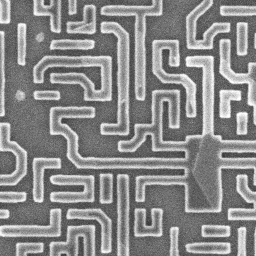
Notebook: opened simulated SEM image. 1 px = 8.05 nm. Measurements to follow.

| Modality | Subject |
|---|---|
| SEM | wiring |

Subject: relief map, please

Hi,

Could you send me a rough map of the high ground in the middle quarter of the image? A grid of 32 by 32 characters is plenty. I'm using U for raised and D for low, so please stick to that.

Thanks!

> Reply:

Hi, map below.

UUUUDDDDDUUUDDUUDDUUDDUUDDDDDDDD
DDDDDDDDDDUUDDUUDDUUDDUUUDDDDDDD
DDDDDDDDDDUUDDUUDDUUDDDUUUDDDDDD
UUUUUUDDDDUUDDUUDDUUDDDDUUUUUUUD
UUUUUUUDDDUUDDUUDDUUDDDDDUUUUUUU
DDDDDUUDDDUUDDUUDDUUDDDDDDDDDDUU
DDDDDUUUDUUUDDUUDDUUDDDDDDDDDDDU
DDDDDUUUUUUUDDUUDDUUDDUUUUUUUDDU
DDDDDUUUUUUUDDUUDDUUDDUUUUUUUDDU
DDDDDDDDDDDDDDUUDDDDDDUUUDUUUDDU
DDDDDDDDDDDDDDUUDDDDDDUUUDUUUDDU
UUUUUUUDDDDDDDUUDDDDDDUUUDUUUDDU
UUUUUUUDDDDDDDUUDDDDDDUUDDUUUDDU
DDDDDDDDDDDDDDUUDDDDDDUUDDUUUDDD
DDDDDDDDDDDDDDUUDDDDDDUUDDUUUDDD
UDDDDDDDDUUUUUUUDDUUUUUUDDUUUDDD
UUDDDDDDDUUUUUUUDDUUUUUUDDDDDDDD
UUUDDDDDDDDDDDUUDDUUUDUUDDDDDDDD
DUUDDDDDDDDDDDDDDUUUDDUUDDDDDDDU
DUUDDDDDDDDDDDUUUUUUDDUUUDDDDDUU
DUUDDDDDDDDDDDUUUUUDDDUUUUUUUUUU
DUUDDDDDDDDDDDUUUUDDDDUUUUUUUUUU
DUUUDDDDDDDDDDDDDDDDDDDDDDDDDDDU
DUUUUDUDDDDDDDDDDDDDDDDDDDDDDDUU
DDUUUUUUUUUUUUUUUUUUUUUUUUUUUUUU
DDDUUUUUUUUUUUUUUUUUUUUUUUUUUUUU
DDDDDDDDDDDDDDDDDDDDDDDDDDDDDDUU
DDDDDDDDDDDDDDDDDDDDDDDDDDDDDDUU
UUUUUUUDDUUUDDUUDDUUUUUUUUUUUUUU
UUUUUUUDDUUUDDUUDDUUUUUUUUUUUUUU
DDDDDUUDDUUUDDUUDDUUDDDDDDDDDDUU
DDDDDUUDDUUUDDUUDDUUDDDDDDDDDDDU